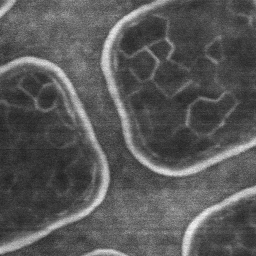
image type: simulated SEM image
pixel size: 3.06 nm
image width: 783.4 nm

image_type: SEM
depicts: raised bodies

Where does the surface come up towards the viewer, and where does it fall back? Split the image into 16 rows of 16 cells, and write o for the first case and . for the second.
.........ooooooo
.......ooooooooo
.......ooooooooo
.......ooooooooo
oooo...ooooooooo
oooo...ooooooooo
ooooo..ooooooooo
ooooo...oooooooo
oooooo..oooooooo
oooooo..ooooooo.
ooooooo...oo....
ooooooo.........
oooooo........oo
ooooo........ooo
ooo.........oooo
o...........oooo